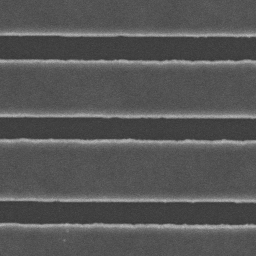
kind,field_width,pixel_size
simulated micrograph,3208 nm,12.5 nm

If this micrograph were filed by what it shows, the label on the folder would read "lines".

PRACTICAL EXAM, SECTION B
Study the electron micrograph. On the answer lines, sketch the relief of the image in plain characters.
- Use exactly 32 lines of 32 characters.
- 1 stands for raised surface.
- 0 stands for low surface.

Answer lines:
11111111111111111111111111111111
11111111111111111111111111111111
11111111111111111111111111111111
11111111111111111111111111111111
00000000000000001111111111111111
00000000000000000000000000000000
00000000000000000000000000000000
00000000000000000000000000000000
11111111111111111111111111111111
11111111111111111111111111111111
11111111111111111111111111111111
11111111111111111111111111111111
11111111111111111111111111111111
11111111111111111111111111111111
01101101110111111111111111111111
00000000000000000000000000000000
00000000000000000000000000000000
11111111100001011000000000000000
11111111111111111111111111111111
11111111111111111111111111111111
11111111111111111111111111111111
11111111111111111111111111111111
11111111111111111111111111111111
11111111111111111111111111111111
11111111111111111111111111111111
00000000000000000000000000000000
00000000000000000000000000000000
00000000000000000000000000000000
11111111111111111111111111111111
11111111111111111111111111111111
11111111111111111111111111111111
11111111111111111111111111111111